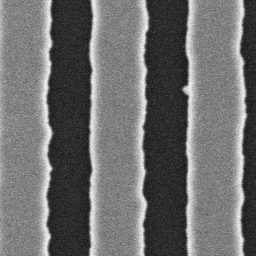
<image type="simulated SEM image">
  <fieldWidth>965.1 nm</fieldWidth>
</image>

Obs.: lines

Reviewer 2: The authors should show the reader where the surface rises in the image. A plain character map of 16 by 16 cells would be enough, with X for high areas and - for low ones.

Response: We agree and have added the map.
XXX---XXX---XXX-
XXX---XXX---XXX-
XXX---XXX---XXX-
XXX---XXX---XXX-
XXX---XXX---XXX-
XXX---XXX---XXX-
XXX---XXX---XXX-
XXX---XXX---XXX-
XXX---XXX---XXX-
XXX---XXX---XXX-
XXX---XXX---XXX-
XXX---XXX---XXX-
XXX---XXX---XXX-
XXX---XXX---XXX-
XXX---XXX---XXX-
XXX---XXX---XXX-